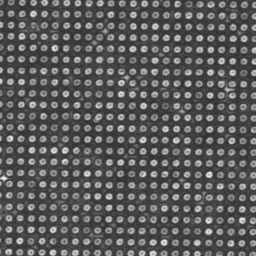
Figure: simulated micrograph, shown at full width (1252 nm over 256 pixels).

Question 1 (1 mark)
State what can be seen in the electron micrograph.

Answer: a regular array of raised bodies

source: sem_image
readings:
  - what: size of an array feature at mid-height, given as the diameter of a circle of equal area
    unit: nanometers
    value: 29.7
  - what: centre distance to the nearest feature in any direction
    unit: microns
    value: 0.0532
